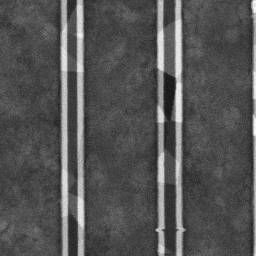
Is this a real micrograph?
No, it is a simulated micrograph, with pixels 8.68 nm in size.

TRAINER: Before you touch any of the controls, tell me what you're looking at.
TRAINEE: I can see one or a few lines or trenches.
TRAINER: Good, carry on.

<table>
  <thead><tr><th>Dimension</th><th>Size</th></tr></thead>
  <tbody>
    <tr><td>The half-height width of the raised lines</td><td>143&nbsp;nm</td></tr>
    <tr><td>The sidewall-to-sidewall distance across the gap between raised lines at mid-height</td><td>702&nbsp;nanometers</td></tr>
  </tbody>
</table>